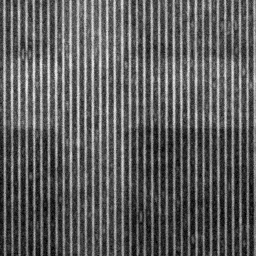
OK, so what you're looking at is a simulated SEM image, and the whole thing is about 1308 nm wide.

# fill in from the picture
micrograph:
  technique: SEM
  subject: parallel lines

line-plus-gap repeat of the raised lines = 37.6 nanometres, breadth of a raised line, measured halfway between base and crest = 2.13 pixels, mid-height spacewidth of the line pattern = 27.5 nanometres